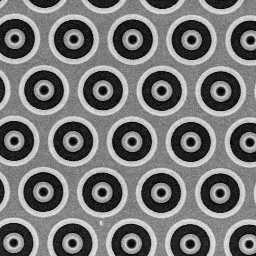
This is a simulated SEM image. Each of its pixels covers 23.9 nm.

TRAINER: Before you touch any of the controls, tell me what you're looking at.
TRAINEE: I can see an array of small figures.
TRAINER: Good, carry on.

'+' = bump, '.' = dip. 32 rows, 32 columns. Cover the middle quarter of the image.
++++++++++++++++++++++++++++++++
++++++++....++++++++++.....+++++
++++++........+++++++.......++++
+++++.........++++++.........+++
+++++..........++++...........++
.+++....+++....++++....+++....++
.+++....++++...++++...++++....++
.+++....++++...++++....+++....++
++++.....+.....++++....++.....++
+++++..........+++++.........+++
++++++........++++++.........+++
+++++++.....+++++++++......+++++
++++++++++++++++++++++++++++++++
++++++++++++++++++++++++++++++++
.....+++++++++......+++++++++...
......+++++++........+++++++....
.......+++++..........+++++.....
........++++..........++++......
++++....+++....++++....+++....++
++++....+++....++++....+++....++
.+++....+++....++++....+++....++
.......+++++..........++++.....+
.......+++++..........+++++.....
......+++++++........+++++++....
....+++++++++++....++++++++++...
++++++++++++++++++++++++++++++++
+++++++++.++++++++++++++.+++++++
++++++.......++++++++......+++++
+++++.........++++++.........+++
+++++..........++++..........+++
++++....+++....++++....++.....++
++++....+++....++++...++++....++